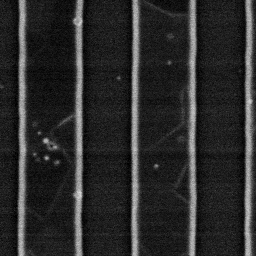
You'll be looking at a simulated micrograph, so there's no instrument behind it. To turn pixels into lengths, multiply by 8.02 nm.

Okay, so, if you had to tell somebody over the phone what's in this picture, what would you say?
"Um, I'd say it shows wiring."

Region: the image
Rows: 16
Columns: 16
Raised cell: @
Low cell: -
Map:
-@@@@---@@@@----
-@@@@----@@@----
-@@@@----@@@----
-@@@@---@@@@----
-@@@@---@@@@----
-@@@@---@@@@----
-@@@@---@@@@----
-@@@@---@@@@----
-@@@@---@@@@----
-@@@@---@@@@----
-@@@@---@@@@----
-@@@@---@@@@----
-@@@@---@@@@----
-@@@@---@@@@---@
-@@@@---@@@@---@
-@@@@---@@@@----